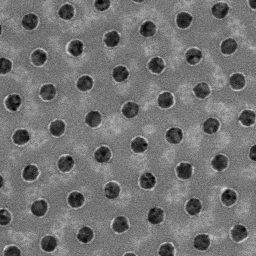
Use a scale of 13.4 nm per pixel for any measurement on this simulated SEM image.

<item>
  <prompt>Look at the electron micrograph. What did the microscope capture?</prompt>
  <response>a regular array of raised bodies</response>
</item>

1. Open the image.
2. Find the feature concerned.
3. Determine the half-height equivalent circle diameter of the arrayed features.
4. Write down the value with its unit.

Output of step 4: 248 nm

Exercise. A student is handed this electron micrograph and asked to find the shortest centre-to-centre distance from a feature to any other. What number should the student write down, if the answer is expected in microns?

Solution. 0.487